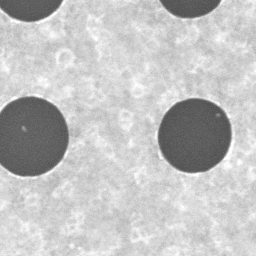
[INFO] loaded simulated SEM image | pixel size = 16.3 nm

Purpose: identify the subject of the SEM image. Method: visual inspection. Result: holes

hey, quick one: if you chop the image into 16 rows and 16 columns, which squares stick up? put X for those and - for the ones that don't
----XXXXXX---XXX
XXXXXXXXXXXXXXXX
XXXXXXXXXXXXXXXX
XXXXXXXXXXXXXXXX
XXXXXXXXXXXXXXXX
XXXXXXXXXXXXXXXX
X--XXXXXXXX--XXX
----XXXXXX----XX
----XXXXXX----XX
----XXXXXX----XX
---XXXXXXXX--XXX
XXXXXXXXXXXXXXXX
XXXXXXXXXXXXXXXX
XXXXXXXXXXXXXXXX
XXXXXXXXXXXXXXXX
XXXXXXXXXXXXXXXX